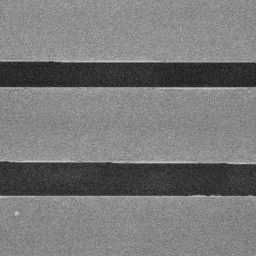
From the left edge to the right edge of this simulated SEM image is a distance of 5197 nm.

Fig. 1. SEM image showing lines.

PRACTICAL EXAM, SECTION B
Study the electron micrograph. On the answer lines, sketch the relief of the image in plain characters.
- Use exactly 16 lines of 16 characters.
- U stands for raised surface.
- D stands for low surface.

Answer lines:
UUUUUUUUUUUUUUUU
UUUUUUUUUUUUUUUU
UUUUUUUUUUUUUUUU
UUUUUUUUUUUUUUUU
DDDDDDDDDDDDDDDD
DDDDDDDDDDDDDDDD
UUUUUUUUUUUUUUUU
UUUUUUUUUUUUUUUU
UUUUUUUUUUUUUUUU
UUUUUUUUUUUUUUUU
DDDDDDDDDDDDDDDD
DDDDDDDDDDDDDDDD
UUUUUUUUUUUUUUUU
UUUUUUUUUUUUUUUU
UUUUUUUUUUUUUUUU
UUUUUUUUUUUUUUUU